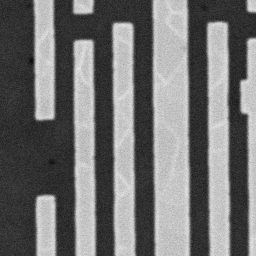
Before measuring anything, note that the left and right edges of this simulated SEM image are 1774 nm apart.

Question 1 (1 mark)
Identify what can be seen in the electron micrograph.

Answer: wiring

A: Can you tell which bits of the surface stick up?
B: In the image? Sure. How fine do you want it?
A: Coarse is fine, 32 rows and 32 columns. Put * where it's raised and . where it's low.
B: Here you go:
....***..**........****........*
....***..**........****.........
....***............****.........
....***.......**...****...**....
....***.......**...****...**....
....***..***..**...****...**...*
.....**..***..**...****...**...*
....***..***..**...****...**...*
....***..***..**...****...**...*
.....**..***..**...****...**...*
.....**..***..**...****...**..**
.....**..***..***..****...**..**
.....**..***..***..****...**..**
.....**..***..***..****...**..**
.....**..***..***..****...**...*
.........***..***..****...**...*
.........***..***..****...**...*
.........***..***..****...**...*
.........***..***..****...**...*
..........**..***..****...**...*
..........**..***..****...**...*
..........**..***..****...**...*
..........**..***..****...**...*
..........**..***..****...**...*
..........**..***..****...**...*
.....**...**..***..****...***..*
.....**...**..***..****...**...*
.....**...**..***...***...**...*
.....**...**..***...***...***..*
.....**...**..***...****..***..*
.....**...**..***...****..***..*
.....**...**..***...***...***..*